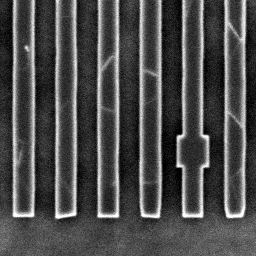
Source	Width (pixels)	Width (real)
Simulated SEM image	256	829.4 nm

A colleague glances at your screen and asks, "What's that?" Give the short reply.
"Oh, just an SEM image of wiring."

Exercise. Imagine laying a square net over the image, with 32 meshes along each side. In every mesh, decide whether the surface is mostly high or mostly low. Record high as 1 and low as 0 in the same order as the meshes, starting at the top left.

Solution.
00110001100011100011000110001110
00110001100011100011000110001110
00110001100011100011000110001110
00110001100011100011000110001110
00110001100011100011000110001110
00110001100011100011000110001110
00110001110011100011000110001110
00110001110011100011000110001110
00110001110011100011000110001110
00110001110011100011000110001110
00110001110011100011000110001110
00110001110011100011000110001110
00110001100011100011000110001110
00110001100011100011000110001110
00110001100011100011000110001110
00110001110011100011000110001110
00110001110011100011000110001110
00110001110011100011001111001110
00110001110011100011001111001110
00110001110011100011001111001110
00110001110011100011001111001110
00110001110011100011000110001100
00110001100011100011000110001110
00110001100011100011000110001110
00110001100011100011000110001110
00110001100011100011000110001110
00110001100011100011000110001100
00000000000000000000000000000000
00000000000000000000000000000000
00000000000000000000000000000000
00000000000000000000000000000000
00000000000000000000000000000000